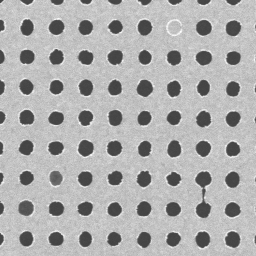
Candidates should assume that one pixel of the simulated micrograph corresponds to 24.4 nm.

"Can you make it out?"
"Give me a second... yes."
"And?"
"a regular array of holes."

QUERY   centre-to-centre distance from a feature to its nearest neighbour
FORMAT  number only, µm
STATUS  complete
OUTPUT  0.717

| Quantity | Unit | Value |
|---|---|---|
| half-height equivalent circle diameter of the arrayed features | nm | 367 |